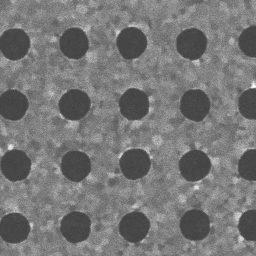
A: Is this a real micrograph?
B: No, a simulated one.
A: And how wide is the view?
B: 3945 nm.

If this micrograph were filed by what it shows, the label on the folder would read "a regular array of holes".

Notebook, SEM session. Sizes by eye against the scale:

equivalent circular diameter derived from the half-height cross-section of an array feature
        490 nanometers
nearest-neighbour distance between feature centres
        915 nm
